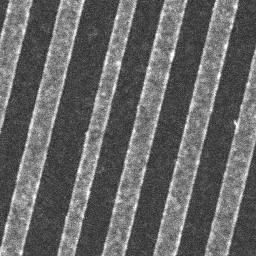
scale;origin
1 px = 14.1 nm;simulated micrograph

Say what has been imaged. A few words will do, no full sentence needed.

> parallel lines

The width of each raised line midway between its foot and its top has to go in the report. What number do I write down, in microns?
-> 0.299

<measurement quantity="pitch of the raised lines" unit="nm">703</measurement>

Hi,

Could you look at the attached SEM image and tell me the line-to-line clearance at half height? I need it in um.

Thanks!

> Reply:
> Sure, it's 0.405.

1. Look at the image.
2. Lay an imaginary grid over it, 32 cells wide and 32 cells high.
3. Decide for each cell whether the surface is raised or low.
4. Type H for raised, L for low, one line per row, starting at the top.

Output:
LHHHLLLLHHLLLLLHHLLLLHHLLLLHHHLL
LHHHLLLHHHLLLLLHHLLLHHHLLLLHHLLL
LHHLLLLHHHLLLLHHHLLLHHHLLLHHHLLL
HHHLLLLHHHLLLLHHLLLLHHLLLLHHHLLL
HHHLLLLHHLLLLLHHLLLLHHLLLLHHHLLL
HHHLLLHHHLLLLLHHLLLHHHLLLLHHLLLL
HHLLLLHHHLLLLHHLLLLHHHLLLHHHLLLL
HHLLLLHHHLLLLHHLLLLHHLLLLHHHLLLL
HHLLLLHHLLLLLHHLLLLHHLLLLHHHLLLH
HHLLLHHHLLLLLHHLLLHHHLLLLHHLLLLH
HLLLLHHHLLLLHHLLLLHHHLLLHHHLLLLH
HLLLLHHHLLLLHHLLLLHHHLLLHHHLLLLH
HLLLLHHLLLLLHHLLLLHHLLLLHHHLLLHH
HLLLHHHLLLLLHHLLLHHHLLLLHHLLLLHH
LLLLHHHLLLLLHHLLLHHHLLLLHHLLLLHH
LLLLHHHLLLLHHLLLLHHHLLLHHHLLLLHH
LLLLHHLLLLLHHLLLLHHLLLLHHHLLLHHH
LLLHHHLLLLLHHLLLHHHLLLLHHLLLLHHH
LLLHHHLLLLLHLLLLHHHLLLLHHLLLLHHH
LLLHHHLLLLHHLLLLHHHLLLHHHLLLLHHL
LLLHHLLLLLHHLLLLHHLLLLHHHLLLHHHL
LLHHHLLLLLHHLLLHHHLLLLHHHLLLHHHL
LLHHHLLLLLHHLLLHHHLLLLHHLLLLHHHL
LLHHHLLLLHHLLLLHHHLLLHHHLLLLHHLL
LLHHLLLLLHHLLLLHHLLLLHHHLLLLHHLL
LHHHLLLLLHHLLLHHHLLLLHHHLLLHHHLL
LHHHLLLLLHHLLLHHHLLLLHHLLLLHHHLL
LHHHLLLLHHLLLLHHHLLLHHHLLLLHHLLL
LHHLLLLLHHLLLLHHLLLLHHHLLLHHHLLL
LHHLLLLLHHLLLHHHLLLLHHHLLLHHHLLL
HHHLLLLLHHLLLHHHLLLLHHLLLLHHHLLL
HHHLLLLHHLLLLHHHLLLHHHLLLLHHLLLL